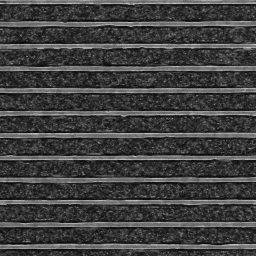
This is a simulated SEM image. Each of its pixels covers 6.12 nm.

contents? parallel lines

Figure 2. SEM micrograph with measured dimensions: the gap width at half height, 108 nanometres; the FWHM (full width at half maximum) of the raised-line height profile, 4.38 px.